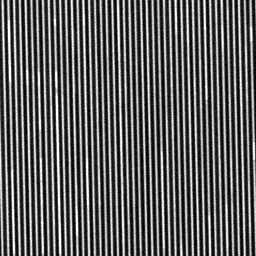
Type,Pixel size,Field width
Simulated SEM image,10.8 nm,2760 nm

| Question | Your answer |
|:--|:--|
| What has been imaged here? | parallel lines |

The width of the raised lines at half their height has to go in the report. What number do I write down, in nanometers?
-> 18.9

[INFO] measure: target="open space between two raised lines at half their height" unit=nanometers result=47.2